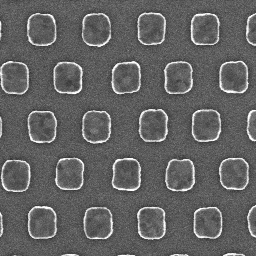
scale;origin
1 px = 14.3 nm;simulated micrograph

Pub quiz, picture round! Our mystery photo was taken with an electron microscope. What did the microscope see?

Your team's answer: a regular array of raised bodies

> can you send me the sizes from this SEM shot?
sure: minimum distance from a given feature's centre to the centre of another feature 773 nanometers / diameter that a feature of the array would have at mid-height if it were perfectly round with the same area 0.458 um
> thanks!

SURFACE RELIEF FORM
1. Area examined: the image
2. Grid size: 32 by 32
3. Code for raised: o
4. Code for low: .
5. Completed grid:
................................
................................
....ooo...oooo...oooo...ooo....o
...oooo...oooo...oooo...ooo....o
...oooo...oooo...oooo...ooo....o
....oo.....oo.....o......oo....o
................................
................................
ooo....ooo....ooo....ooo....ooo.
ooo....ooo....ooo....ooo....ooo.
oooo...ooo....ooo....ooo....ooo.
.oo....ooo.....oo....oo......o..
................................
................................
....ooo....ooo....ooo...ooo....o
....ooo...oooo....ooo...oooo...o
....ooo...oooo...oooo...ooo....o
....ooo....oo.....oo.....oo.....
................................
................................
.oo....ooo....ooo....ooo....ooo.
oooo...ooo....oooo...ooo...oooo.
oooo...ooo....oooo...ooo....ooo.
.oo.....oo.....oo....ooo....oo..
................................
................................
....ooo....ooo...ooo.....oo....o
....ooo...oooo...oooo...oooo...o
....ooo...oooo...oooo...oooo...o
....ooo....ooo....oo.....oo.....
................................
................................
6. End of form